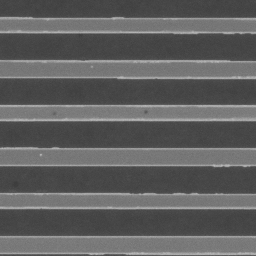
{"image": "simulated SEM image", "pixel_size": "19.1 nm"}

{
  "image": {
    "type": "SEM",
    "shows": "lines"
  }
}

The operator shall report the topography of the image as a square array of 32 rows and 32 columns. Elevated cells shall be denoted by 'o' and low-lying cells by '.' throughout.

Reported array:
................................
................................
oooooooooooooooooooooooooooooooo
oooooooooooooooooooooooooooooooo
................................
................................
................................
................................
oooooooooooooooooooooooooooooooo
oooooooooooooooooooooooooooooooo
................................
................................
................................
oooooooooooooooooooooooooooooooo
oooooooooooooooooooooooooooooooo
................................
................................
................................
o..oo...........................
oooooooooooooooooooooooooooooooo
oooooooooooooooooooooooooooooooo
................................
................................
................................
oooooooooooooooooooooooooooooooo
oooooooooooooooooooooooooooooooo
................................
................................
................................
................................
oooooooooooooooooooooooooooooooo
oooooooooooooooooooooooooooooooo